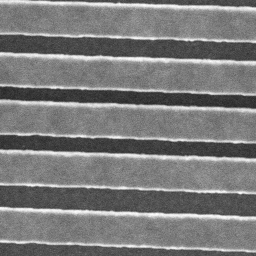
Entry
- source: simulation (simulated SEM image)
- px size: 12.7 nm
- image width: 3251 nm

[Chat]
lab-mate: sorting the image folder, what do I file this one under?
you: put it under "lines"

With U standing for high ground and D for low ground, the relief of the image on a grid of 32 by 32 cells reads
UUUUUUUUUUUUUUDDDDDDDDDDDDDDDDDD
UUUUUUUUUUUUUUUUUUUUUUUUUUUUUUUU
UUUUUUUUUUUUUUUUUUUUUUUUUUUUUUUU
UUUUUUUUUUUUUUUUUUUUUUUUUUUUUUUU
DDDDDDDDUUUUUUUUUUUUUUUUUUUUUUUU
DDDDDDDDDDDDDDDDDDDDDDDDDDDDDDDD
DDDDDDDDDDDDDDDDDDDDDDDDDDDDDDDD
UUUUUUUUUUUUUUUUUUUUUUUUUDDDDDDD
UUUUUUUUUUUUUUUUUUUUUUUUUUUUUUUU
UUUUUUUUUUUUUUUUUUUUUUUUUUUUUUUU
UUUUUUUUUUUUUUUUUUUUUUUUUUUUUUUU
DDDDDDDDDDDDDDDDDDDDUUUUUUUUUUUU
DDDDDDDDDDDDDDDDDDDDDDDDDDDDDDDD
UUUUUUUUUUUUUUUUUUUUUUUUUUUDDDDD
UUUUUUUUUUUUUUUUUUUUUUUUUUUUUUUU
UUUUUUUUUUUUUUUUUUUUUUUUUUUUUUUU
UUUUUUUUUUUUUUUUUUUUUUUUUUUUUUUU
DDDDDDDDDDDDDDDDDDDDDUUUUUUUUUUU
DDDDDDDDDDDDDDDDDDDDDDDDDDDDDDDD
UUUUUUUUUUUUUUUUUUUUDDDDDDDDDDDD
UUUUUUUUUUUUUUUUUUUUUUUUUUUUUUUU
UUUUUUUUUUUUUUUUUUUUUUUUUUUUUUUU
UUUUUUUUUUUUUUUUUUUUUUUUUUUUUUUU
DDDDDDDDDDDDDUUUUUUUUUUUUUUUUUUU
DDDDDDDDDDDDDDDDDDDDDDDDDDDDDDDD
DDDDDDDDDDDDDDDDDDDDDDDDDDDDDDDD
UUUUUUUUUUUUUDDDDDDDDDDDDDDDDDDD
UUUUUUUUUUUUUUUUUUUUUUUUUUUUUUUU
UUUUUUUUUUUUUUUUUUUUUUUUUUUUUUUU
UUUUUUUUUUUUUUUUUUUUUUUUUUUUUUUU
DDDDDDDDDDUUUUUUUUUUUUUUUUUUUUUU
DDDDDDDDDDDDDDDDDDDDDDDDDDDDDDDD